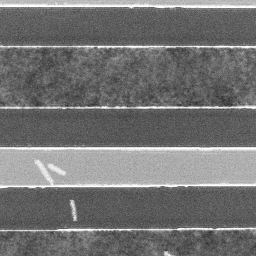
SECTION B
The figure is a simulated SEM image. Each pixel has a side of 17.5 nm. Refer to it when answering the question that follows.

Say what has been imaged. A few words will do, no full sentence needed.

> lines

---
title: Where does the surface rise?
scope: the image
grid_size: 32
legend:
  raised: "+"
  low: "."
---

++++++++++++++++++++++++++++++++
................................
................................
................................
................................
................................
++++++++++++++++++++++++++++++++
++++++++++++++++++++++++++++++++
++++++++++++++++++++++++++++++++
++++++++++++++++++++++++++++++++
++++++++++++++++++++++++++++++++
++++++++++++++++++++++++++++++++
++++++++++++++++++++++++++++++++
................................
................................
................................
................................
................................
................................
++++++++++++++++++++++++++++++++
++++++++++++++++++++++++++++++++
++++++++++++++++++++++++++++++++
++++++++++++++++++++++++++++++++
................................
................................
................................
................................
................................
................................
++++++++++++++++++++++++++++++++
++++++++++++++++++++++++++++++++
++++++++++++++++++++++++++++++++